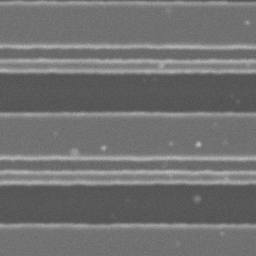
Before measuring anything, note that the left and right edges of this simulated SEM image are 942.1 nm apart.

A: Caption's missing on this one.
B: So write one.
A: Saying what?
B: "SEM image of lines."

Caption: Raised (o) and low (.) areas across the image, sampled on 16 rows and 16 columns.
oooooooooooooooo
oooooooooooooooo
oooooooooooooooo
oooooooooooooooo
......o..ooooooo
................
................
oooooooooooooooo
oooooooooooooooo
oooooooooooooooo
oooooooooooooooo
................
................
................
oooooooooooooooo
oooooooooooooooo